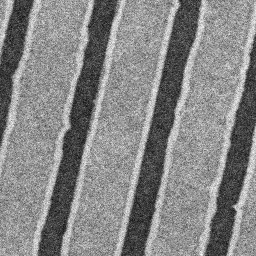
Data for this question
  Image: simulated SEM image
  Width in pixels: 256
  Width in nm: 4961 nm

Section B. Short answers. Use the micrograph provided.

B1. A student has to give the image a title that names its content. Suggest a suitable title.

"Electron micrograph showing one or a few lines or trenches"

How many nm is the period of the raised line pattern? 1580